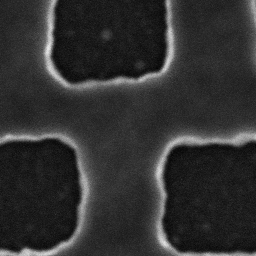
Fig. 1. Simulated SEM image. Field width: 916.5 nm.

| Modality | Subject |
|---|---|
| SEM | holes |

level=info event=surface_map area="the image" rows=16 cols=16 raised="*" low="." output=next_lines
***.......******
***.......******
***.......******
***.......******
****......******
****************
****************
****************
****************
.....******.....
.....*****......
.....*****......
.....*****......
.....*****......
.....*****......
...********.....